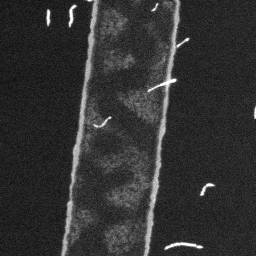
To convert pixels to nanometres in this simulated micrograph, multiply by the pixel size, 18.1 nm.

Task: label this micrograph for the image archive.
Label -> one or a few lines or trenches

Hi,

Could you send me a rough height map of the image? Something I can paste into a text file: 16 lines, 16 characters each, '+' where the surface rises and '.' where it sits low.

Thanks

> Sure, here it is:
++++++.....+++++
++++++.....+++++
++++++.....+++++
++++++.....+++++
++++++.....+++++
+++++.....++++++
+++++.....++++++
+++++.....++++++
+++++.....++++++
+++++.....++++++
+++++.....++++++
+++++.....++++++
++++......++++++
++++.....+++++++
++++.....+++++++
++++.....+++++++